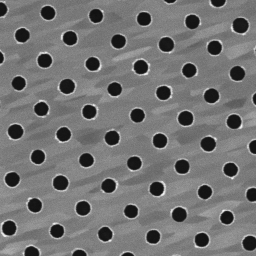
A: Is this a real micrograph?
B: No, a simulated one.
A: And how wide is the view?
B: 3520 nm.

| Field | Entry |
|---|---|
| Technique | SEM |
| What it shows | a regular array of holes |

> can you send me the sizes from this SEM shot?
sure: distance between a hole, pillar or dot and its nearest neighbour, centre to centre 465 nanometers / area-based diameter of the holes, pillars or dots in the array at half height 200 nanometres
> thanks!